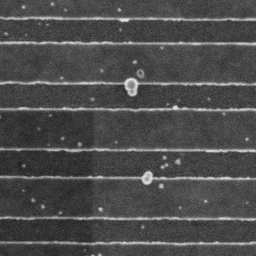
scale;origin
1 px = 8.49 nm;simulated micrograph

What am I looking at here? lines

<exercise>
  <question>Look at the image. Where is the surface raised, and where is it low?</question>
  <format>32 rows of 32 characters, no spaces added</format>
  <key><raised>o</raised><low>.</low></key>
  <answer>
oooooooooooooooooooooooooooooooo
oooooooooooooooooooooooooooooooo
................................
................................
................................
oooooooooooooooooooooooooooooooo
oooooooooooooooooooooooooooooooo
oooooooooooooooooooooooooooooooo
oooooooooooooooooooooooooooooooo
oooooooooooooooooooooooooooooooo
...............ooo..o..ooooooooo
................o...............
................................
................................
oooooooooooooooooooooooooooooooo
oooooooooooooooooooooooooooooooo
oooooooooooooooooooooooooooooooo
oooooooooooooooooooooooooooooooo
oooooooooooooooooooooooooooooooo
................................
................................
................................
oooooooooooooooooooooooooooooooo
oooooooooooooooooooooooooooooooo
oooooooooooooooooooooooooooooooo
oooooooooooooooooooooooooooooooo
oooooooooooooooooooooooooooooooo
................................
................................
................................
oooooooooooooooooooooooooooooooo
oooooooooooooooooooooooooooooooo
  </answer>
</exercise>